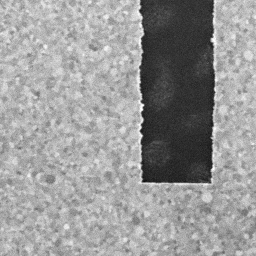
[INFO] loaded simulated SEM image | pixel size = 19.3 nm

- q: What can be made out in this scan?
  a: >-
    one or a few lines or trenches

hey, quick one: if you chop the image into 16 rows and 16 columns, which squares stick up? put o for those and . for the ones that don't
ooooooooo....ooo
ooooooooo....ooo
ooooooooo....ooo
ooooooooo....ooo
ooooooooo....ooo
ooooooooo....ooo
ooooooooo....ooo
ooooooooo....ooo
ooooooooo....ooo
ooooooooo....ooo
ooooooooo....ooo
oooooooooooooooo
oooooooooooooooo
oooooooooooooooo
oooooooooooooooo
oooooooooooooooo